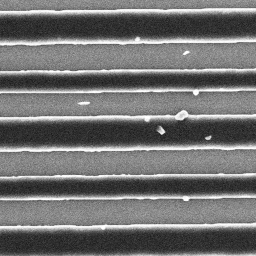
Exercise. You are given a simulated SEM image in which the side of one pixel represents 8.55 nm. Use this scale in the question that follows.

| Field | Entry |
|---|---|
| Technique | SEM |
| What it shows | lines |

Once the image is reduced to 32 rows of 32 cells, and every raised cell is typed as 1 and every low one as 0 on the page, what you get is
00000000000000000000000000000000
11111111111111111111111111111111
11111111111111111111111111111111
11111111111111111111111111111111
11111111111111111111111111111111
00000000000000000000000000000000
00000000000000000000000000000000
00000000000000000000000000000000
00000000000000000000000000000000
11111111111111111111111111111111
11111111111111111111111111111111
11111111111110000000000010000000
00000000000000000000000000000000
00000000000000000000000000000000
00000000000000000000001101111111
11111111111111111111111111111111
11111111111111111111111111111111
11111111111111111111111111111111
11111111111111111111111111011111
00000000000000000000000000000000
00000000000000000000000000000000
00000000000000000000000000000000
11111111111111111111111111111111
11111111111111111111111111111111
11111111111111111111111111111111
00000000000000000000000000000000
00000000000000000000000000000000
00000000000000000000000000000000
11111111111111111111111111111111
11111111111111111111111111111111
11111111111111111111111111111111
11111111111111111111111111111111